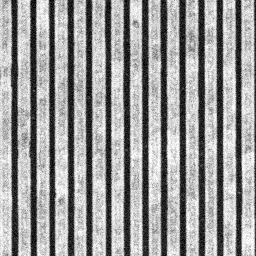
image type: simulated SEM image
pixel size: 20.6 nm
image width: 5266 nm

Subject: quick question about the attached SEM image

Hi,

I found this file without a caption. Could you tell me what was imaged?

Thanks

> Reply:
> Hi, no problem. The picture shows parallel lines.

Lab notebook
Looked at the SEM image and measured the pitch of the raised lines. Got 384 nm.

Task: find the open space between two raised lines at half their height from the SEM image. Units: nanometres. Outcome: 195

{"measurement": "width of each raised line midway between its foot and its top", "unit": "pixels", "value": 9.5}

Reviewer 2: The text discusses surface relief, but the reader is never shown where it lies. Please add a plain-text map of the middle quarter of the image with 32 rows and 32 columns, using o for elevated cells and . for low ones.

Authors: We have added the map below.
o..oo...oo..oo...oo...oo..oo...o
o..oo...oo..oo...oo...oo..oo...o
o..oo...oo..oo...oo...oo..oo...o
o..oo...oo..oo...oo...oo..oo...o
o..oo...oo..oo...oo...oo..oo...o
o..oo...oo..oo...oo...oo..oo...o
o..oo...oo..oo...oo...oo..oo...o
o..oo...oo..oo...oo...oo..oo...o
o..oo...oo..oo...oo...oo..oo...o
o..oo...oo..oo...oo...oo..oo...o
o..oo...oo..oo...oo...oo..oo...o
o..oo...oo..oo...oo...oo..oo...o
o..oo...oo..oo...oo...oo..oo...o
o..oo...oo..oo...oo...oo..oo...o
o..oo...oo..oo...oo...oo..oo...o
o..oo...oo..oo...oo...oo..oo...o
...oo...oo..oo...oo...oo..oo...o
o..oo...oo..oo...oo...oo..oo...o
o..oo...oo..oo...oo...oo..oo...o
o..oo...oo..oo...oo...oo..oo...o
o..oo...oo..oo...oo...oo..oo...o
o..oo...oo..oo...oo...oo..oo...o
o..oo...oo..oo...oo...oo..oo...o
o..oo...oo..oo...oo...oo..oo...o
o..oo...oo..oo...oo...oo..oo...o
o..oo...oo..oo...oo...oo..oo...o
o..oo...oo..ooo..oo...oo..oo...o
o..oo...oo..ooo..oo...oo..oo...o
o..oo...oo..ooo..oo...oo..oo...o
o..oo...oo..ooo..oo...oo..oo...o
o..oo...oo..ooo..oo...oo..oo...o
o..oo...oo..ooo..oo...oo..oo...o